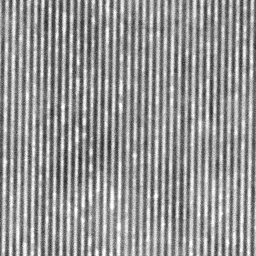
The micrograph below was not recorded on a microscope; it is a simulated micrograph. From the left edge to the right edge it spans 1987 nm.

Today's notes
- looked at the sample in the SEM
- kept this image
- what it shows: parallel lines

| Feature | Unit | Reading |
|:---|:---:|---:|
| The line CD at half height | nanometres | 13.6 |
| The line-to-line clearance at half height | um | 0.0417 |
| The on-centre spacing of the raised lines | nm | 56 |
